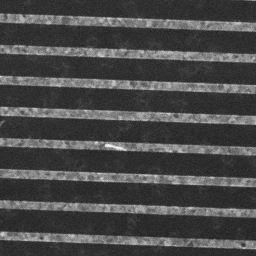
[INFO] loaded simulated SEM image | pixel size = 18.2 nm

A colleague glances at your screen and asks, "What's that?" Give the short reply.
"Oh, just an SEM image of parallel lines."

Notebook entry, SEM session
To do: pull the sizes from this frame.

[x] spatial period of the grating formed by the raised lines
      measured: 566 nm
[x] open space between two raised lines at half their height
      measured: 428 nanometres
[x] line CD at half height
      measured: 136 nm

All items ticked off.